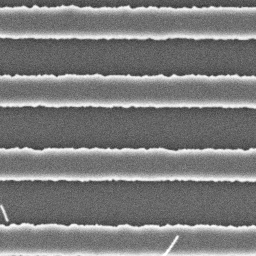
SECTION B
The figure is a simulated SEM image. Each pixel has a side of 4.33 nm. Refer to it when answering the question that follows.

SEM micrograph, lines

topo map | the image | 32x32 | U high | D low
DDDDDDDDDDDDDDDDDDDDDDDDDDDDDDDD
UUUUUUUUUUUUUUUUUUUUUUUUUUUUUUUU
UUUUUUUUUUUUUUUUUUUUUUUUUUUUUUUU
UUUUUUUUUUUUUUUUUUUUUUUUUUUUUUUU
UUUUUUUUUUUUUUUUUUUUUUUUUUUUUUUU
DDDDDDDDDDDDDDDDDDDDDDDDDDDDDDDD
DDDDDDDDDDDDDDDDDDDDDDDDDDDDDDDD
DDDDDDDDDDDDDDDDDDDDDDDDDDDDDDDD
DDDDDDDDDDDDDDDDDDDDDDDDDDDDDDDD
UUUUUUUDUUUUUUUUUDUUUUDUUUDUUUDD
UUUUUUUUUUUUUUUUUUUUUUUUUUUUUUUU
UUUUUUUUUUUUUUUUUUUUUUUUUUUUUUUU
UUUUUUUUUUUUUUUUUUUUUUUUUUUUUUUU
DDDDDDDDDDDDDDDDDDDDDDDDDDDDDDDD
DDDDDDDDDDDDDDDDDDDDDDDDDDDDDDDD
DDDDDDDDDDDDDDDDDDDDDDDDDDDDDDDD
DDDDDDDDDDDDDDDDDDDDDDDDDDDDDDDD
DDDDDDDDDDDDDDDDDDDDDDDDDDDDDDDD
DDDDDDDDDDDDDDDDDDDDDDDDDDDDDDDD
UUUUUUUUUUUUUUUUUUUUUUUUUUUUUUUU
UUUUUUUUUUUUUUUUUUUUUUUUUUUUUUUU
UUUUUUUUUUUUUUUUUUUUUUUUUUUUUUUU
UDUDUDDUUUUUUDDDUUUUDUDDUUUUUUUU
DDDDDDDDDDDDDDDDDDDDDDDDDDDDDDDD
DDDDDDDDDDDDDDDDDDDDDDDDDDDDDDDD
DDDDDDDDDDDDDDDDDDDDDDDDDDDDDDDD
DDDDDDDDDDDDDDDDDDDDDDDDDDDDDDDD
DDDDDDDDDDDDDDDDDDDDDDDDDDDDDDDD
UUUUUUUUUUUUUUUUUUUUUUUUUUUUUUUU
UUUUUUUUUUUUUUUUUUUUUUUUUUUUUUUU
UUUUUUUUUUUUUUUUUUUUUUUUUUUUUUUU
UUUUUUUUUUUUUUUUUUUUUUUUUUUUUUUU